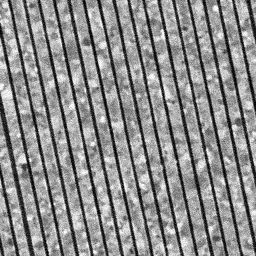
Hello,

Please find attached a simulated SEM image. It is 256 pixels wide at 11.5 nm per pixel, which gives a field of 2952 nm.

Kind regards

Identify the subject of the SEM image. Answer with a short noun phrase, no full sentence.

parallel lines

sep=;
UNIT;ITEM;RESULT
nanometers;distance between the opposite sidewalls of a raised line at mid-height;121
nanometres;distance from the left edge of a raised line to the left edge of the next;169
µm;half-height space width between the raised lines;0.0409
